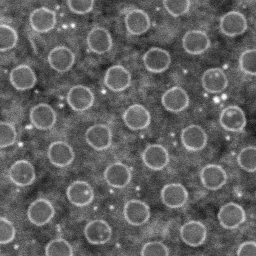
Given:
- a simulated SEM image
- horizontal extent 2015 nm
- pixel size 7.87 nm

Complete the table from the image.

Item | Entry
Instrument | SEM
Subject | a regular array of raised bodies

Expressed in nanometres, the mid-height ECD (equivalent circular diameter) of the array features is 188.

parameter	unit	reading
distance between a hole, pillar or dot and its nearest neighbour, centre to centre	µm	0.332